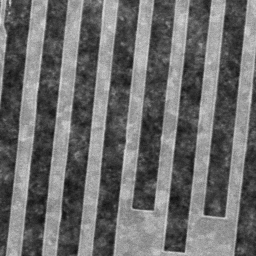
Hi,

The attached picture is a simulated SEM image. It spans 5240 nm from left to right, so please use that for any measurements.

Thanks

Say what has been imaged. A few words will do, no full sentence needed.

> parallel lines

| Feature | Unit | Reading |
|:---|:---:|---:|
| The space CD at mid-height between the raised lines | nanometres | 458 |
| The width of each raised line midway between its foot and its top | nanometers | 280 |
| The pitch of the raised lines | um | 0.727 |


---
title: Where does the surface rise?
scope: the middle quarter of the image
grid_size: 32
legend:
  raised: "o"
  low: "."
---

ooo......ooo.....oooo.....oooo..
ooo.....oooo.....oooo.....oooo..
ooo.....oooo.....ooo......ooo...
ooo.....ooo......ooo......ooo...
ooo.....ooo......ooo......ooo...
oo......ooo......ooo......ooo...
oo......ooo......ooo......ooo...
oo......ooo......ooo......ooo...
oo......ooo......ooo......ooo...
oo......ooo......ooo.....oooo...
oo.....ooo.......ooo.....oooo...
oo.....ooo......ooo......oooo...
oo.....ooo......ooo......ooo....
oo.....ooo......ooo......ooo....
o......ooo......ooo......ooo....
o......ooo......ooo......ooo....
o......ooo......ooo......ooo....
o......ooo......ooo......ooo....
o......ooo......ooo.....oooo....
o......ooo......ooo.....ooo.....
o......ooo......ooo.....ooo.....
o.....oooo.....ooo......ooo.....
o.....ooo......ooo......ooo.....
o.....ooo......ooo......ooo.....
......ooo......ooo......ooo.....
......ooo......ooo......ooo.....
......ooo......ooo......ooo.....
......ooo......ooo......ooo.....
......ooo......ooo......ooo.....
.....oooo......ooo.....ooo......
.....oooo.....ooo......ooo......
.....oooo.....ooo......ooo......